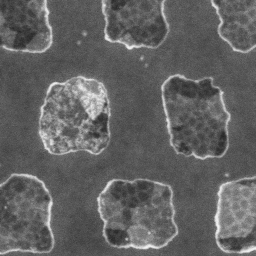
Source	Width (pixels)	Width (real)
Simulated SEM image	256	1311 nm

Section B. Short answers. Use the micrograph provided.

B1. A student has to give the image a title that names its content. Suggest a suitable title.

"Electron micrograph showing raised bodies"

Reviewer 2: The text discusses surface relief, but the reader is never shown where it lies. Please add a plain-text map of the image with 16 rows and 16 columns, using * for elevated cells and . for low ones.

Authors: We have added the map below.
***...****...***
***....***....**
***....***....**
................
................
...***....****..
...****...****..
...****...****..
...****....***..
...*.......***..
................
***....***....**
***...*****...**
***...*****...**
***....****...**
***...........**